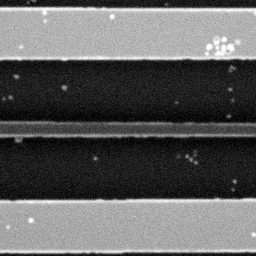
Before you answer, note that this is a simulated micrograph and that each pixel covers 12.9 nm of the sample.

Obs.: lines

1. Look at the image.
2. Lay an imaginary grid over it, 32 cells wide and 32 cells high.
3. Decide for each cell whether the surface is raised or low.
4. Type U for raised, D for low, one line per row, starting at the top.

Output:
DDDDDDDDDDDDDDDDDDDDDDDDDDDDDDDD
UUUUUUUUUUUUUUUUUUUUUUUUUUUUUUUU
UUUUUUUUUUUUUUUUUUUUUUUUUUUUUUUU
UUUUUUUUUUUUUUUUUUUUUUUUUUUUUUUU
UUUUUUUUUUUUUUUUUUUUUUUUUUUUUUUU
UUUUUUUUUUUUUUUUUUUUUUUUUUUUUUUU
UUUUUUUUUUUUUUUUUUUUUUUUUUUUUUUU
DDDDDDDDDDDDDDDDDDDDDDDDDDDDDDDD
DDDDDDDDDDDDDDDDDDDDDDDDDDDDDDDD
DDDDDDDDDDDDDDDDDDDDDDDDDDDDDDDD
DDDDDDDDDDDDDDDDDDDDDDDDDDDDDDDD
DDDDDDDDDDDDDDDDDDDDDDDDDDDDDDDD
DDDDDDDDDDDDDDDDDDDDDDDDDDDDDDDD
DDDDDDDDDDDDDDDDDDDDDDDDDDDDDDDD
DDDDDDDDDDDDDDDDDDDDDDDDDDDDDDDD
UUUUUUUUUUUUUUUUUUUUUUDUUDDDDDDD
UUUUUUUUUUUUUUUUUUUUUUUUUUUUUUUU
DDDDDDDDDDDDDDDDDDDDDDDDDDDDDDDD
DDDDDDDDDDDDDDDDDDDDDDDDDDDDDDDD
DDDDDDDDDDDDDDDDDDDDDDDDDDDDDDDD
DDDDDDDDDDDDDDDDDDDDDDDDDDDDDDDD
DDDDDDDDDDDDDDDDDDDDDDDDDDDDDDDD
DDDDDDDDDDDDDDDDDDDDDDDDDDDDDDDD
DDDDDDDDDDDDDDDDDDDDDDDDDDDDDDDD
DDDDDDDDDDDDDDDDDDDDDDDDDDDDDDDD
UUUUUUUUUUUUUUUUUUUUUUUUUUUUUUUU
UUUUUUUUUUUUUUUUUUUUUUUUUUUUUUUU
UUUUUUUUUUUUUUUUUUUUUUUUUUUUUUUU
UUUUUUUUUUUUUUUUUUUUUUUUUUUUUUUU
UUUUUUUUUUUUUUUUUUUUUUUUUUUUUUUU
UUUUUUUUUUUUUUUUUUUUUUUUUUUUUUUU
UUUUUUUUUUUUUUUUDDDDDDDDDDDDDDDD